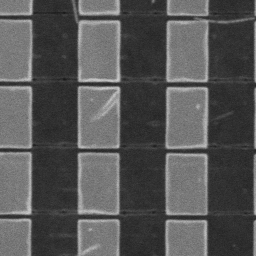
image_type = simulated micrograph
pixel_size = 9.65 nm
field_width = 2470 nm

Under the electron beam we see wiring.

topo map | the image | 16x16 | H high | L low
HHLLLHHLLLLHHLLL
HHLLLHHLLLLHHLLL
HHLLLHHLLLHHHLLL
HHLLLHHLLLHHHLLL
HHLLLHLLLLHHHLLL
HHLLLHLLLLLHHLLL
HHLLLHHLLLHHHLLL
HHLLLHHLLLHHHLLL
HHLLLHHLLLHHHLLL
HHLLLHHLLLLHLLLL
HHLLLHHLLLHHHLLL
HHLLLHHLLLHHHLLL
HHLLLHHLLLHHHLLL
HHLLLLHLLLLHHLLL
HHLLLHHLLLHHHLLL
HHLLLHHLLLHHHLLL